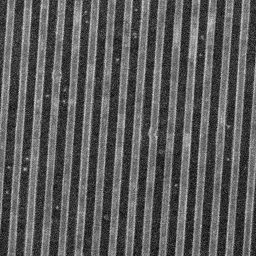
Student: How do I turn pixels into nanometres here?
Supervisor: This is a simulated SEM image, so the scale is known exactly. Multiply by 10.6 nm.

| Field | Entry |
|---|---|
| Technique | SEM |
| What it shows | parallel lines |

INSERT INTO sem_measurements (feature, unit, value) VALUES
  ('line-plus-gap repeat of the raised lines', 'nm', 178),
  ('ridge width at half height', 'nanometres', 70.3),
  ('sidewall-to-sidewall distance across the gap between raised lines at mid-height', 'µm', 0.101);